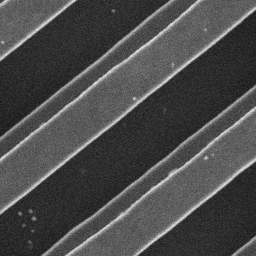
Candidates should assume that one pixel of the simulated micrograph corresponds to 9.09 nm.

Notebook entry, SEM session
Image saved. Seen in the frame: lines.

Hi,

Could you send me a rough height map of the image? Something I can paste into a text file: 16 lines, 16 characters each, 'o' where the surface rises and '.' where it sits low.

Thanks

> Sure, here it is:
oooo......oooooo
ooo......oooooo.
oo......oooooo..
.......ooooo....
.....oooooo.....
....oooooo......
...oooooo......o
.oooooo......ooo
oooooo......oooo
ooooo......ooooo
oooo......ooooo.
oo......oooooo..
o......oooooo...
......oooooo....
....oooooo......
...oooooo......o